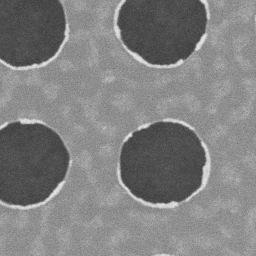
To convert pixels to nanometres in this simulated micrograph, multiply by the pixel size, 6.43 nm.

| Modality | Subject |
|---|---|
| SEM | holes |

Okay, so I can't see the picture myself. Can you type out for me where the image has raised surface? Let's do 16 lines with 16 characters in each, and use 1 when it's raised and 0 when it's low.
0000111100000111
0000111000000111
0000111100001111
0001111110001111
1111111111111111
1111111111111111
1111111111111111
1111111111111111
0000111100001111
0000111100000111
0000111100000111
0000111100000111
0001111110011111
1111111111111111
1111111111111111
1111111111111111